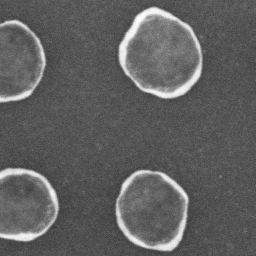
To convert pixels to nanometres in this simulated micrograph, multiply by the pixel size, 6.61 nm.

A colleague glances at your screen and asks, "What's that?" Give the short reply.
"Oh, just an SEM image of raised bodies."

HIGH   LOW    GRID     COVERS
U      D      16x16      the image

DDDDDDDDDDDDDDDD
UDDDDDDDUUUDDDDD
UUDDDDDDUUUUDDDD
UUUDDDDDUUUUUDDD
UUUDDDDDUUUUDDDD
UUDDDDDDDUUUDDDD
DDDDDDDDDDDDDDDD
DDDDDDDDDDDDDDDD
DDDDDDDDDDDDDDDD
DDDDDDDDDDDDDDDD
DDDDDDDDDDDDDDDD
UUUDDDDDUUUDDDDD
UUUDDDDUUUUUDDDD
UUUDDDDUUUUUDDDD
UUUDDDDDUUUDDDDD
DDDDDDDDDDDDDDDD